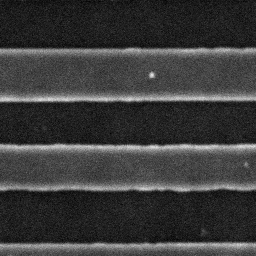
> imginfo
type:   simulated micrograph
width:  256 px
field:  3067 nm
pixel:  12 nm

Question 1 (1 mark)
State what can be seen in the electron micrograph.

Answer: lines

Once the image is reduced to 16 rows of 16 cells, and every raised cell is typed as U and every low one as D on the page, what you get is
DDDDDDDDDDDDDDDD
DDDDDDDDDDDDDDDD
DDDDDDDDDDDDDDDD
UUUUUUUUUUUUUUUU
UUUUUUUUUUUUUUUU
UUUUUUUUUUUUUUUU
DDDDDDDDDDDDDDDD
DDDDDDDDDDDDDDDD
DDDDDDDDDDDDDDDD
UUUUUUUUUUUUUUUU
UUUUUUUUUUUUUUUU
UUUUUUUUUUUUUUUU
DDDDDDDDDDDDDDDD
DDDDDDDDDDDDDDDD
DDDDDDDDDDDDDDDD
UUUUUUUUUUUUUUUU